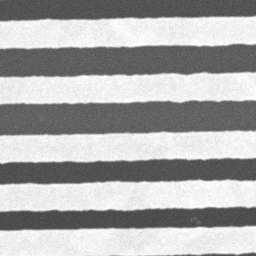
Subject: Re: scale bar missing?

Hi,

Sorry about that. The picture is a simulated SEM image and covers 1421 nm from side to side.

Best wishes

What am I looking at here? lines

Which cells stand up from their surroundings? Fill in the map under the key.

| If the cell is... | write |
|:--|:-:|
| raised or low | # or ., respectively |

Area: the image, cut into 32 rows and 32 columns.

................................
................................
.....##.....####################
################################
################################
#############################...
................................
................................
................................
..........######################
################################
################################
############################.##.
................................
................................
................................
............................####
################################
################################
################################
................................
................................
................................
################################
################################
################################
................................
................................
.....................#..########
################################
################################
################################